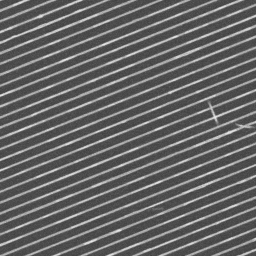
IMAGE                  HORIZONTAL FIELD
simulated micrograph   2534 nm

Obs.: parallel lines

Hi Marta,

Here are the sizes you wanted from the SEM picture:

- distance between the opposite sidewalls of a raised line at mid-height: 18.4 nm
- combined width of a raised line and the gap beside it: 98.1 nanometers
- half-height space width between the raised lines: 81.7 nm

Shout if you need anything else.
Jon